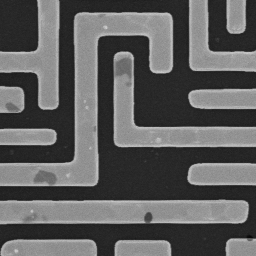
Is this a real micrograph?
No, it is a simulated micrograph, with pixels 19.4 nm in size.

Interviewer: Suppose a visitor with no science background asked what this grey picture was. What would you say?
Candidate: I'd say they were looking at wiring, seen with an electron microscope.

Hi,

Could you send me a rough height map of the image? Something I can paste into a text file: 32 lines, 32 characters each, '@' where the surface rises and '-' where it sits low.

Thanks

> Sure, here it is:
-----@@-----------------@@--@@@-
-----@@-----------------@@--@@@-
-----@@--@@@@@@@@@@@@---@@--@@@-
-----@@--@@@@@@@@@@@@---@@--@@@-
-----@@--@@@@-----@@@---@@------
-----@@--@@@-------@@---@@------
@--@@@@--@@@-------@@---@@@--@@@
@@@@@@@--@@@--@@@--@@---@@@@@@@@
@@@@@@@--@@@--@@@--@@---@@@@@@@@
-----@@--@@@--@@@---------------
-----@@--@@@--@@@---------------
@@@--@@--@@@--@@@-------@@@@@@@@
@@@--@@--@@@--@@@-------@@@@@@@@
@@@--@@--@@@--@@@--------@@@@@@@
---------@@@--@@@---------------
---------@@@--@@@---------------
@@@@@@@--@@@--@@@@@@@@@@@@@@@@@@
@@@@@@@--@@@--@@@@@@@@@@@@@@@@@@
---------@@@--------------------
---------@@@--------------------
@@@@@@@@@@@@-------------@@@@@@@
@@@@@@@@@@@@------------@@@@@@@@
@@@@@@@@@@@@------------@@@@@@@@
--------------------------------
--------------------------------
@@@@@@@@@@@@@@@@@@@@@@@@@@@@@@@-
@@@@@@@@@@@@@@@@@@@@@@@@@@@@@@@-
@@@@@@@@@@@@@@@@@@@@@@@@@@@@@@@-
--------------------------------
--------------------------------
-@@@@@@@@@@@--@@@@@@@-------@@@@
@@@@@@@@@@@@--@@@@@@@-------@@@@